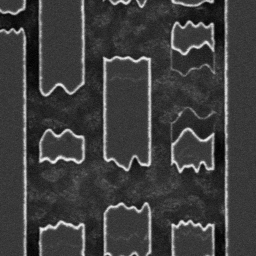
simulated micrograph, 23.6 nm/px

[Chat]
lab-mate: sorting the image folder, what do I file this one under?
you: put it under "parallel lines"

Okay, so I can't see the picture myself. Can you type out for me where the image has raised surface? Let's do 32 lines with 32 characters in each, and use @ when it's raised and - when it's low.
@@@--@@@@@-------@----@@@---@@@@
@@---@@@@@------------------@@@@
-----@@@@@------------------@@@@
-----@@@@@------------@@@@@-@@@@
@@@--@@@@@------------@@@@@-@@@@
@@@--@@@@@------------@@@@@-@@@@
@@@--@@@@@------------@-----@@@@
@@@--@@@@@---@@@@@@---------@@@@
@@@--@@@@@---@@@@@@---------@@@@
@@@--@@@@@---@@@@@@---------@@@@
@@@--@@@@@---@@@@@@---------@@@@
@@@--@--@----@@@@@@---------@@@@
@@@----------@@@@@@---------@@@@
@@@----------@@@@@@---------@@@@
@@@----------@@@@@@---------@@@@
@@@----------@@@@@@---------@@@@
@@@---@-@----@@@@@@----@----@@@@
@@@--@@@@@---@@@@@@---@@@@@-@@@@
@@@--@@@@@---@@@@@@---@@@@@-@@@@
@@@--@@@@@---@@@@@@---@@@@@-@@@@
@@@------------@--@---@@@@@-@@@@
@@@-------------------------@@@@
@@@-------------------------@@@@
@@@-------------------------@@@@
@@@-------------------------@@@@
@@@-------------------------@@@@
@@@----------@@@@@@---------@@@@
@@@----------@@@@@@---------@@@@
@@@--@@@@@---@@@@@@---@@@@@-@@@@
@@@--@@@@@@--@@@@@@---@@@@@-@@@@
@@@--@@@@@@--@@@@@@---@@@@@-@@@@
@@@--@@@@@---@@@@@@---@@@@@-@@@@